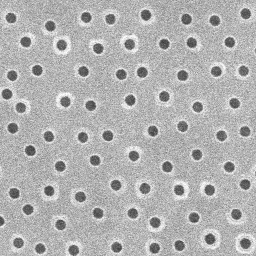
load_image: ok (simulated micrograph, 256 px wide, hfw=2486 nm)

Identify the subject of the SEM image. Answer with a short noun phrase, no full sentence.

a regular array of holes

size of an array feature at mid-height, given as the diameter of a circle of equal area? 114 nm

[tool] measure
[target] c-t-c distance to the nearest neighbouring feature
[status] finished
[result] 238 nm